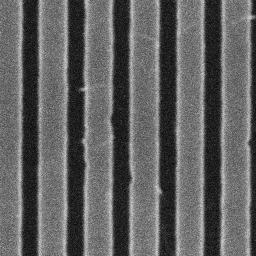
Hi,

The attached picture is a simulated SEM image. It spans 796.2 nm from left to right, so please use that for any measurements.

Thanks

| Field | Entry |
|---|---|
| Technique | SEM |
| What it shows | parallel lines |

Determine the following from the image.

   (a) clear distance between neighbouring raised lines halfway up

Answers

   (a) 0.0583 microns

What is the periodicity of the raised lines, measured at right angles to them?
142 nm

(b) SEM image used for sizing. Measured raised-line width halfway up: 85.5 nanometers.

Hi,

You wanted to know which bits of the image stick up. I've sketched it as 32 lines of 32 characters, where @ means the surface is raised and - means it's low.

@@@--@@@---@@@--@@@@--@@@---@@@-
@@@--@@@---@@@--@@@@--@@@---@@@-
@@@--@@@---@@@--@@@@--@@@---@@@-
@@@--@@@---@@@--@@@@--@@@---@@@-
@@@--@@@---@@@--@@@@--@@@---@@@-
@@@--@@@---@@@--@@@@--@@@---@@@-
@@@--@@@---@@@--@@@@--@@@---@@@-
@@@--@@@---@@@--@@@@--@@@---@@@-
@@@--@@@---@@@--@@@@--@@@---@@@-
@@@--@@@---@@@--@@@@--@@@---@@@-
@@@--@@@---@@@--@@@@--@@@---@@@-
@@@--@@@---@@@--@@@@--@@@---@@@-
@@@--@@@---@@@--@@@@--@@@---@@@-
@@@--@@@---@@@--@@@@--@@@---@@@-
@@@--@@@---@@@--@@@@--@@@---@@@-
@@@--@@@---@@@--@@@@--@@@---@@@-
@@@--@@@---@@@--@@@@--@@@---@@@-
@@@--@@@--@@@@--@@@@--@@@---@@@-
@@@--@@@---@@@--@@@@--@@@---@@@-
@@@--@@@---@@@--@@@@--@@@---@@@-
@@@--@@@---@@@--@@@@--@@@---@@@-
@@@--@@@---@@@--@@@@--@@@---@@@-
@@@--@@@---@@@--@@@@--@@@---@@@-
@@@--@@@---@@@--@@@@--@@@---@@@-
@@@--@@@---@@@--@@@@--@@@---@@@-
@@@--@@@---@@@--@@@@--@@@---@@@-
@@@--@@@---@@@--@@@@--@@@---@@@-
@@@--@@@---@@@--@@@@--@@@---@@@-
@@@--@@@---@@@--@@@@--@@@---@@@-
@@@--@@@---@@@--@@@@--@@@---@@@-
@@@--@@@---@@@--@@@@--@@@---@@@-
@@@--@@@---@@@--@@@@--@@@---@@@-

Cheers